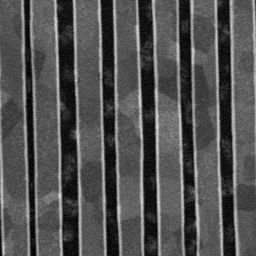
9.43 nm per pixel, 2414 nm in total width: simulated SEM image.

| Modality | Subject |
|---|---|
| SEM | parallel lines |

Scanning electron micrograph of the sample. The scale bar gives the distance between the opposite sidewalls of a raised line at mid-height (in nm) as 231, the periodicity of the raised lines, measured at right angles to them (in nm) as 371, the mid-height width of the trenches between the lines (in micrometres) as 0.14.